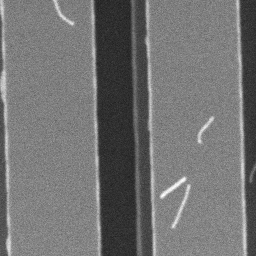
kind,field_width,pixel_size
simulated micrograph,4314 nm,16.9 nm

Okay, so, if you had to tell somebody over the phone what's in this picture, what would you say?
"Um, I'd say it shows lines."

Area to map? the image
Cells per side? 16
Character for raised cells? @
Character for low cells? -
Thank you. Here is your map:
@@@@@@---@@@@@@-
@@@@@@---@@@@@@-
@@@@@@---@@@@@@-
@@@@@@---@@@@@@-
@@@@@@---@@@@@@-
@@@@@@---@@@@@@-
@@@@@@---@@@@@@-
@@@@@@---@@@@@@-
@@@@@@---@@@@@@-
@@@@@@---@@@@@@-
@@@@@@---@@@@@@-
@@@@@@---@@@@@@-
@@@@@@---@@@@@@-
@@@@@@----@@@@@-
@@@@@@----@@@@@-
-@@@@@----@@@@@-